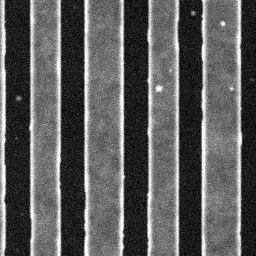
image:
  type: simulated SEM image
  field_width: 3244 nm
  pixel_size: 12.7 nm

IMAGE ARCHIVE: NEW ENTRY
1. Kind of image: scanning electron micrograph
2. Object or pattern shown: lines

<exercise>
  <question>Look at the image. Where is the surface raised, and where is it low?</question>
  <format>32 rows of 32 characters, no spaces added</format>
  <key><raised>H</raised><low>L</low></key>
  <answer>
LLLLHHHLLLLHHHHLLLLHHHLLLHHHHHLL
LLLLHHHLLLLHHHHLLLLHHHLLLHHHHHLL
LLLLHHHLLLLHHHHLLLLHHHLLLHHHHHLL
HLLLHHHLLLLHHHHLLLLHHHLLLHHHHHLL
HLLLHHHLLLLHHHHLLLLHHHLLLHHHHHLL
HLLLHHHLLLLHHHHLLLLHHHLLLHHHHHLL
HLLLHHHLLLLHHHHLLLLHHHLLLHHHHHLL
LLLLHHHLLLLHHHHLLLLHHHLLLHHHHHLL
LLLLHHHLLLLHHHHLLLLHHHLLLHHHHHLL
HLLLHHHLLLLHHHHLLLLHHHLLLHHHHHLL
HLLLHHHLLLLHHHHLLLLHHHLLLHHHHHLL
HLLLHHHLLLLHHHHLLLLHHHLLLHHHHHLL
HLLLHHHLLLLHHHHLLLLHHHLLLHHHHHLL
HLLLHHHLLLLHHHHLLLLHHHLLLHHHHHLL
HLLLHHHLLLLHHHHLLLLHHHLLLHHHHHLL
HLLLHHHLLLLHHHHLLLLHHHLLLHHHHHLL
HLLLHHHLLLLHHHHLLLLHHHLLLHHHHHLL
LLLLHHHLLLLHHHHLLLLHHHLLLHHHHHLL
LLLLHHHLLLLHHHHLLLLHHHLLLHHHHHLL
LLLLHHHLLLLHHHHLLLLHHHLLLHHHHHLL
LLLLHHHLLLLHHHHLLLLHHHLLLHHHHHLL
HLLLHHHLLLLHHHHLLLLHHHLLLHHHHHLL
HLLLHHHLLLLHHHHLLLLHHHLLLHHHHHLL
HLLLHHHLLLLHHHHLLLLHHHLLLHHHHHLL
HLLLHHHLLLLHHHHLLLLHHHLLLHHHHHLL
LLLLHHHLLLLHHHHLLLLHHHLLLHHHHHLL
HLLLHHHLLLLHHHHLLLLHHHLLLHHHHHLL
HLLLHHHLLLLHHHHLLLLHHHLLLHHHHHLL
HLLLHHHLLLLHHHHLLLLHHHLLLHHHHHLL
HLLLHHHLLLLHHHHLLLLHHHLLLHHHHHLL
HLLLHHHLLLLHHHHLLLLHHHLLLHHHHHLL
LLLLHHHLLLLHHHHLLLLHHHLLLHHHHHLL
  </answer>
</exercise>